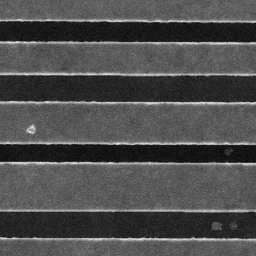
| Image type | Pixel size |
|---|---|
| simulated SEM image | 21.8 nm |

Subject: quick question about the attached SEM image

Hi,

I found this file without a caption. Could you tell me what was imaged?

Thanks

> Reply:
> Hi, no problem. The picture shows lines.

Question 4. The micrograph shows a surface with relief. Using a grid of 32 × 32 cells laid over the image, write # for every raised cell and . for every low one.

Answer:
################################
################################
################################
................................
................................
################################
################################
################################
################################
................................
................................
................................
................................
################################
################################
################################
################################
################################
................................
................................
################################
################################
################################
################################
################################
################################
................................
................................
................................
................................
################################
################################